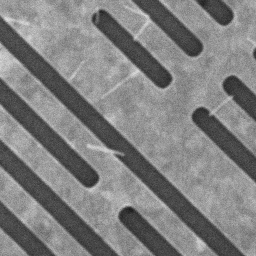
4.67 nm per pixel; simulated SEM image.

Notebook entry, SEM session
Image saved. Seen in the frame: groups of lines, slits or small figures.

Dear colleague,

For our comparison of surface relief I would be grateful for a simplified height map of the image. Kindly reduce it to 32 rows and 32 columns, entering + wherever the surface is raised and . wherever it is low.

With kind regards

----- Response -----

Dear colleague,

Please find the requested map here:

+++++++++++++++++...+++++...++++
++++++++++++..++++....++++...+++
.++++++++++....++++....++++..+++
..++++++++++....++++....++++++++
...++++++++++....++++....+++++++
....++++++++++....++++...+++++++
+....++++++++++....++++..+++++++
++....++++++++++....++++++++++++
+++....++++++++++....+++++++++++
++++....++++++++++....+++++++.++
.++++....++++++++++..+++++++...+
..++++....++++++++++++++++++....
...++++....++++++++++++++++++...
....++++....+++++++++++++.++++..
+....++++....+++++++++++...++++.
++....++++....++++++++++....++++
+++....++++....++++++++++....+++
++++....++++....++++++++++....++
.++++....++++....++++++++++....+
..++++....++++....++++++++++....
...+++++...++++....++++++++++...
+...++++....++++....++++++++++..
++...+++++..+++++....++++++++++.
+++...+++++.++++++....++++++++++
++++....+++++++++++....+++++++++
.++++...++++++++++++....++++++++
..++++....+++++..++++....+++++++
...++++...+++++...++++....++++++
....++++....++++...++++....+++++
+....++++....++++...+++++...++++
++....++++....++++...+++++...+++
+++....++++....++++...+++++...++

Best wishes